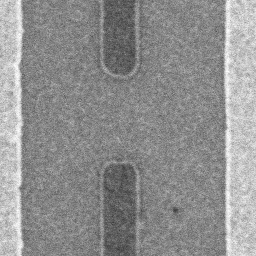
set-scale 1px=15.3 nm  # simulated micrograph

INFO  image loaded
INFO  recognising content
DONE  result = one or a few lines or trenches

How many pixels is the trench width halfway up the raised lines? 89.5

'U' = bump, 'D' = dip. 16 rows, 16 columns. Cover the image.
UDDDDDUUUDDDDDUU
UDDDDDUUUDDDDDUU
UDDDDDUUUDDDDDUU
UDDDDDUUUDDDDDUU
UDDDDDDUDDDDDDUU
UDDDDDDDDDDDDDUU
UDDDDDDDDDDDDDUU
UDDDDDDDDDDDDDUU
UDDDDDDDDDDDDDUU
UDDDDDDDDDDDDDUU
UDDDDDDUDDDDDDUU
UDDDDDUUUDDDDDUU
UDDDDDUUUDDDDDUU
UDDDDDUUUDDDDDUU
UDDDDDUUUDDDDDUU
UDDDDDUUUDDDDDUU